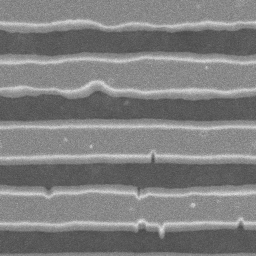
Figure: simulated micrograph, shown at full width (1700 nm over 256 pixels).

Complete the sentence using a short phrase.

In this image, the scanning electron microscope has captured one or a few lines or trenches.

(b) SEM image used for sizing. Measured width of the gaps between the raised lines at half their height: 30.9 pixels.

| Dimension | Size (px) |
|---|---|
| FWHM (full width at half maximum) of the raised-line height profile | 36.1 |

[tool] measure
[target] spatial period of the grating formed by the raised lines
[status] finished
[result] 66.7 pixels